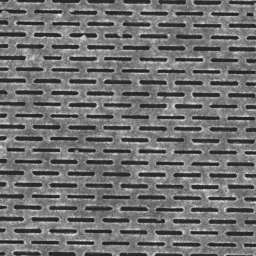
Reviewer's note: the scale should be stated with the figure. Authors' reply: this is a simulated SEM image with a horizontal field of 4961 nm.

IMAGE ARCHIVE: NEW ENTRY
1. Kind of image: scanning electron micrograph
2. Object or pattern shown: a regular array of holes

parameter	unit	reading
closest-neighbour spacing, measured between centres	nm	395